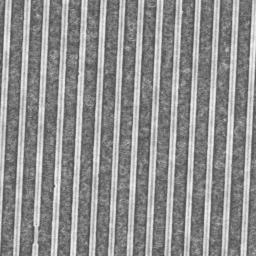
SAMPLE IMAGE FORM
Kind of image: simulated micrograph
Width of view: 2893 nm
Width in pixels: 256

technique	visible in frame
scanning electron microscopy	parallel lines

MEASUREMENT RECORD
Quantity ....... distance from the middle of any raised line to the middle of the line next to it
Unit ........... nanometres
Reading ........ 214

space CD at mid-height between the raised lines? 169 nm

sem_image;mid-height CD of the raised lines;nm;42.3